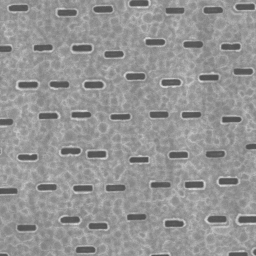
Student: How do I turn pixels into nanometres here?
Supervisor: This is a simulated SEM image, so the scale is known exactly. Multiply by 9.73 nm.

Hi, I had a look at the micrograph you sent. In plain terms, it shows a regular array of holes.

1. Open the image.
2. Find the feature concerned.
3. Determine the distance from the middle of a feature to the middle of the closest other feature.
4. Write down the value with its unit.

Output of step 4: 32.9 pixels